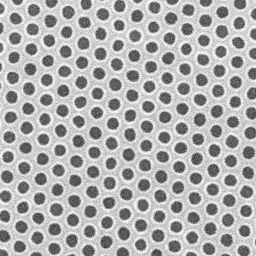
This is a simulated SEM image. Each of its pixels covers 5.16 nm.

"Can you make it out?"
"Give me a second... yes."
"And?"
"a regular array of holes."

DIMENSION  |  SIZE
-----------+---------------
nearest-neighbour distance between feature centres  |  99.5 nm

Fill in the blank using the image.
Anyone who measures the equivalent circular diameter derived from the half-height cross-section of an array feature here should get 0.0701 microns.